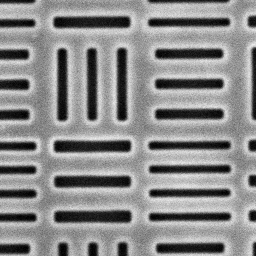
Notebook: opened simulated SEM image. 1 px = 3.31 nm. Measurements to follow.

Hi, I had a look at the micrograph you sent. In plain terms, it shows groups of lines, slits or small figures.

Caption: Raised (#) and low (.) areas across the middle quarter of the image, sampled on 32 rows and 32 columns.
.####....####...################
.####....####...################
.####....####...################
.####....####...#######.........
.####....####...######..........
.####....####...######..........
.####....####...#######.........
.####....####...################
.####....####...################
.####....####...################
.####....####...################
.####....####...#######.........
.####....####...######..........
.#####..#####...#######.........
##############.#################
################################
################################
################################
################################
.................####...........
.................####...........
.................####...........
################################
################################
################################
#####################...........
#####################...........
######################..........
.................###############
.................###############
.................###############
#####################...........